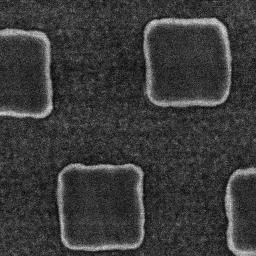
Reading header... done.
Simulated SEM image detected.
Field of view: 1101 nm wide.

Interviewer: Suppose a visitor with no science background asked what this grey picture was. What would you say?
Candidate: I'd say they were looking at raised bodies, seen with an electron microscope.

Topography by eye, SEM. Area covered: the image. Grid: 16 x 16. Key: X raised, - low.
----------------
----------XXXX--
XXX------XXXXX--
XXX------XXXXX--
XXX------XXXXX--
XXX------XXXXX--
XXX-------XX----
----------------
----------------
----------------
----XXXX--------
----XXXXX-----XX
----XXXXX-----XX
----XXXXX-----XX
----XXXXX-----XX
----XXXX-------X